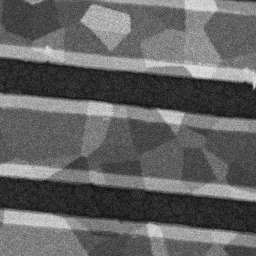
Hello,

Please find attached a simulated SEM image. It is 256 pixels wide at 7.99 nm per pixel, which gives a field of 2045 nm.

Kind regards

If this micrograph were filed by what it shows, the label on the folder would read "one or a few lines or trenches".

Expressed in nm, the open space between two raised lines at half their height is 378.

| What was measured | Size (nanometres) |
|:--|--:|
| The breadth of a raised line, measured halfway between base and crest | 540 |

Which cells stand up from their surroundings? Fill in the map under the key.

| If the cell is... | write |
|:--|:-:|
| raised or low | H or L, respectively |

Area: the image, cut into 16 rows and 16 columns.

HHHHHHHHHHHHHHHL
HHHHHHHHHHHHHHHH
HHHHHHHHHHHHHHHH
LLLLHHHHHHHHHHHH
LLLLLLLLLLLLLHHH
LLLLLLLLLLLLLLLL
HHHLLLLLLLLLLLLL
HHHHHHHHHHHHLLLL
HHHHHHHHHHHHHHHH
HHHHHHHHHHHHHHHH
HHHHHHHHHHHHHHHH
LLLLLLLLLLHHHHHH
LLLLLLLLLLLLLLLL
LLLLLLLLLLLLLLLL
HHHHHHHHHHHLLLLL
HHHHHHHHHHHHHHHH